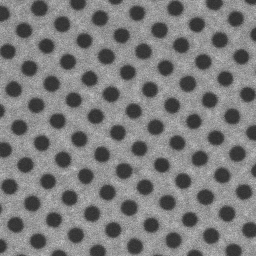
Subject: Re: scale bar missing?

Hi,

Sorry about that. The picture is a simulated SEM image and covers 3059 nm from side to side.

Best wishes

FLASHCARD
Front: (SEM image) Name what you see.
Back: a regular array of holes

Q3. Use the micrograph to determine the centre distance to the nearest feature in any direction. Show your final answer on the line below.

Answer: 318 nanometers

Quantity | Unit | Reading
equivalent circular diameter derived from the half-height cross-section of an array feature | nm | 192